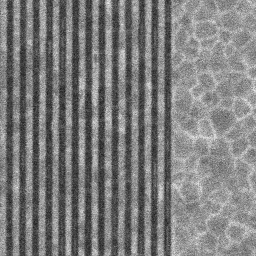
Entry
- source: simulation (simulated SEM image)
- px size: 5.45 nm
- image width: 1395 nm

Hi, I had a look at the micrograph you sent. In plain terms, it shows parallel lines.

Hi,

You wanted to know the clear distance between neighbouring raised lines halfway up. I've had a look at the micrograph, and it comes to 40.9 nanometers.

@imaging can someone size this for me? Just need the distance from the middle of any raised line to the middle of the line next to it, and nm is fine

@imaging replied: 71.8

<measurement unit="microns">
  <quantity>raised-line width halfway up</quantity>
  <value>0.0307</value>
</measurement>